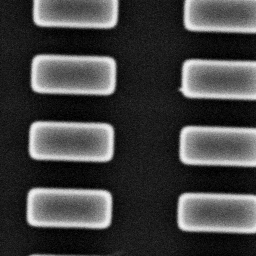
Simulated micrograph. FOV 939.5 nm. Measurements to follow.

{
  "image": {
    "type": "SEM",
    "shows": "groups of lines, slits or small figures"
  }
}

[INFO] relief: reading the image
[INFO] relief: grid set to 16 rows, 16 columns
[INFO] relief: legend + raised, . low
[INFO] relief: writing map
..+++++.....++++
...++++.....++++
................
................
..+++++.....++++
..+++++.....++++
................
................
..+++++....+++++
..+++++....+++++
................
................
..+++++....+++++
..+++++....+++++
................
................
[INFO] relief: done